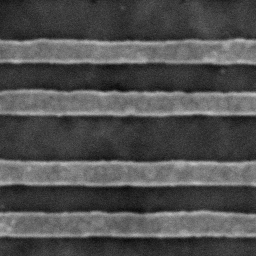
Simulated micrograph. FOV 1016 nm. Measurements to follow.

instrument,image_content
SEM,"lines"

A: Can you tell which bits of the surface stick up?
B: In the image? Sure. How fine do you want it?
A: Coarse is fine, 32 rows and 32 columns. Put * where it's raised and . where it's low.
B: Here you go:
................................
................................
................................
................................
................................
********************************
********************************
********************************
................................
................................
................................
*******..***....................
********************************
********************************
................................
................................
................................
................................
................................
................................
********************************
********************************
********************************
................................
................................
................................
.........................*......
********************************
********************************
.**********...**********....***.
................................
................................